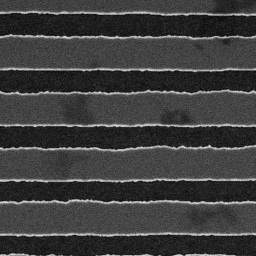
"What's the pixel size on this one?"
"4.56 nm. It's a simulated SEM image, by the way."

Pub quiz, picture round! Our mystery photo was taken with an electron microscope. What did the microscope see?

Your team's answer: lines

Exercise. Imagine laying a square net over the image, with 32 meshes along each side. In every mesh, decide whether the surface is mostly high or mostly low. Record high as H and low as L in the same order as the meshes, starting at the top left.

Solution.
HHHHHHHHHHHHHHHHHHHHHHHHHHHHHHHH
HHHHHHHHHHHHHHHHHHHHHHHHHHHHHHHH
LLLLLLLLLLLLLLLLLLLLLLLLLLLLLLLL
LLLLLLLLLLLLLLLLLLLLLLLLLLLLLLLL
HHHHHHLLLLLLLLLLLLLLLHLLLLLLLHLL
HHHHHHHHHHHHHHHHHHHHHHHHHHHHHHHH
HHHHHHHHHHHHHHHHHHHHHHHHHHHHHHHH
HHHHHHHHHHHHHHHHHHHHHHHHHHHHHHHH
HHHHHHHHHHHHHHHHHHHHHHHHHHHHHHHH
LLLLLLLLLLLLLLLLLLLLLLLLLLLLLLLL
LLLLLLLLLLLLLLLLLLLLLLLLLLLLLLLL
LLLLLLLLLLLLLLLLLLHHHHLLLHHHHHLH
HHHHHHHHHHHHHHHHHHHHHHHHHHHHHHHH
HHHHHHHHHHHHHHHHHHHHHHHHHHHHHHHH
HHHHHHHHHHHHHHHHHHHHHHHHHHHHHHHH
HHHHHHHHHHHHHHHHHHHHHHHHHHHHHHHH
LLLLLLLLLLLLLLLLLLLLLLLLLLLLLLLL
LLLLLLLLLLLLLLLLLLLLLLLLLLLLLLLL
LHHHHLLHHHHHLLLLHHHHHHHHHHHHHHHH
HHHHHHHHHHHHHHHHHHHHHHHHHHHHHHHH
HHHHHHHHHHHHHHHHHHHHHHHHHHHHHHHH
HHHHHHHHHHHHHHHHHHHHHHHHHHHHHHHH
HHHHHHHHHHHHHHHHHHHHHHHHHHHHHHHH
LLLLLLLLLLLLLLLLLLLLLLLLLLLLLLLL
LLLLLLLLLLLLLLLLLLLLLLLLLLLLLLLL
HHHHHHHHHHHHHHHHHHHHHHHHHHHHHHHH
HHHHHHHHHHHHHHHHHHHHHHHHHHHHHHHH
HHHHHHHHHHHHHHHHHHHHHHHHHHHHHHHH
HHHHHHHHHHHHHHHHHHHHHHHHHHHHHHHH
LLLLLLLLLLLLLLLLLLLLLLLLLLLLLLLL
LLLLLLLLLLLLLLLLLLLLLLLLLLLLLLLL
LLLLLLLLLLLLLLLLLLLLLLLLLLLLLLLL